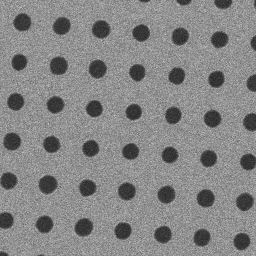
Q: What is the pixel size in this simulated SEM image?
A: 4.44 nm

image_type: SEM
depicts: a regular array of holes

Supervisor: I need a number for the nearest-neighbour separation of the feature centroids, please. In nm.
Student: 175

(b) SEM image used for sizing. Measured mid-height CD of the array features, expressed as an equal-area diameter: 79 nm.